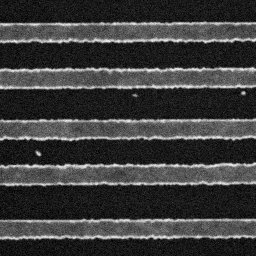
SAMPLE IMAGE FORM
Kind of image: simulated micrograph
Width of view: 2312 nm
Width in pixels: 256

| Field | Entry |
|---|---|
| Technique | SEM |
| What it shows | lines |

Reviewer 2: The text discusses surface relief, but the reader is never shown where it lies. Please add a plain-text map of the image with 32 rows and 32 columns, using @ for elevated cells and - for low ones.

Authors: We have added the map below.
--------------------------------
--------------------------------
--------------------------------
@@@@@@@@@@@@@@@@@@@@@@@@@@@@@@@@
@@@@@@@@@@@@@@@@@@@@@@@@@@@@@@@@
--------------------------------
--------------------------------
--------------------------------
--------------------------------
@@@@@@@@@@@@@@@@@@@@@@@@@@@@@@@@
@@@@@@@@@@@@@@@@@@@@@@@@@@@@@@@@
--------------------------------
--------------------------------
--------------------------------
--------------------------------
@@@@@@@@@@@@@@@@@@@@@@@@@@@@@@@@
@@@@@@@@@@@@@@@@@@@@@@@@@@@@@@@@
--------------------------------
--------------------------------
--------------------------------
----------------------------@--@
@@@@@@@@@@@@@@@@@@@@@@@@@@@@@@@@
@@@@@@@@@@@@@@@@@@@@@@@@@@@@@@@@
--------------------------------
--------------------------------
--------------------------------
--------------------------------
-------------@-@--@@@@@@@@@@@@@@
@@@@@@@@@@@@@@@@@@@@@@@@@@@@@@@@
@@@@@@@@@@@@@@@@@@@@@@@@@@@@@@@@
--------------------------------
--------------------------------